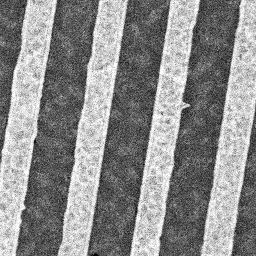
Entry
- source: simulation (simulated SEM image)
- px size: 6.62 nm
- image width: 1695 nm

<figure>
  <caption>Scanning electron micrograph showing one or a few lines or trenches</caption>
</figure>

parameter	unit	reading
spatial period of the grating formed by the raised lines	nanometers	468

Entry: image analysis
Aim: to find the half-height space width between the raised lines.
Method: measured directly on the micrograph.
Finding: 46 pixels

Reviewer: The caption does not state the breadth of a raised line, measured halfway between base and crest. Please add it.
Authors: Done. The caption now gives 164 nm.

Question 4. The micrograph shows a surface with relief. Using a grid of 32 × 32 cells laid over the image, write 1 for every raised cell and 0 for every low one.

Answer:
00001110000001110000001110000011
00011110000011110000011100000011
00011100000011100000011100000011
00011100000011100000011100000011
00011100000011100000011100000011
00011100000011100000011100000111
00011100000011100000011100000111
00111100000111100000111000000111
00111000000111000000111000000111
00111000000111000000111000000111
00111000000111000000111000000111
00111000000111000000111000000111
00111000000111000000111000001111
01111000000111000000111000001111
01110000001110000001110000001110
01110000001110000001110000001110
01110000001110000001110000001110
01110000001110000001110000001110
01110000001110000001110000001110
01110000001110000001110000011110
11110000001100000011110000011100
11100000011100000011100000011100
11100000011100000011100000011100
11100000011100000011100000011100
11100000011100000011100000011100
11100000011100000011000000111100
11000000111100000111000000111000
11000000111000000111000000111000
11000000111000000111000000111000
11000000111000000111000000111000
11000000111000000111000000111000
11000001111000000111000001111000